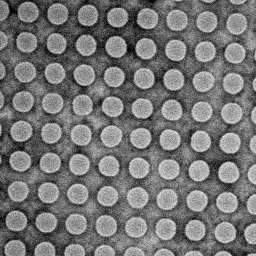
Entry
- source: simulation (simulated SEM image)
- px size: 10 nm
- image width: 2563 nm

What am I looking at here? an array of small figures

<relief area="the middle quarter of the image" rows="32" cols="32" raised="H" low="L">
LLLLHHLLLLLLLLLLLLLLLLLLLLLLLLLL
LLLHHHHLLLLHHHLLLLLHHLLLLLLLLLLL
LLLHHHHLLLHHHHHLLLHHHHLLLHHHHLLL
LLLHHHHLLLHHHHHLLLHHHHLLLHHHHHLL
LLLHHHHLLLLHHHHLLLHHHHLLLHHHHHLL
LLLLLLLLLLLLHLLLLLHHHHLLLHHHHLLL
LLLLLLLLLLLLLLLLLLLLLLLLLLLLLLLL
LLLLLLLLLLLLLLLLLLLLLLLLLLLLLLLL
LLLHHHLLLLLHHLLLLLLLLLLLLLLLLLLL
LLHHHHHLLLHHHHLLLLHHHLLLLLHHLLLL
LLHHHHHLLLHHHHHLLHHHHHLLLHHHHLLL
LLLHHHHLLLHHHHHLLHHHHHLLLHHHHLLL
LLLLHHLLLLLHHHLLLLHHHHLLLHHHHLLL
LLLLLLLLLLLLLLLLLLLLLLLLLHHHHLLL
LLLLLLLLLLLLLLLLLLLLLLLLLLLLLLLL
LLLHHLLLLLLLLLLLLLLLLLLLLLLLLLLL
LLHHHHLLLLHHHHLLLLHHHLLLLLLLLLLL
LLHHHHHLLHHHHHLLLHHHHLLLHHHHLLLL
LLHHHHHLLHHHHHLLLHHHHHLLHHHHHLLL
LLLHHHLLLLHHHHLLLHHHHLLLHHHHHLLL
LLLLLLLLLLLHHLLLLLHHHLLLLHHHLLLL
LLLLLLLLLLLLLLLLLLLLLLLLLLLLLLLL
LLLLLLLLLLLLLLLLLLLLLLLLLLLLLLLL
LLHHHHLLLLHHHLLLLLLLLLLLLLLLLLLL
LLHHHHLLLHHHHLLLLHHHHLLLLHHHLLLL
LHHHHHLLLHHHHHLLHHHHHLLLHHHHHLLL
LLHHHHLLLHHHHHLLHHHHHLLLHHHHHLLH
LLLHHLLLLLHHHLLLLHHHHLLLHHHHLLLH
LLLLLLLLLLLLLLLLLLLLLLLLLHHLLLLL
LLLLLLLLLLLLLLLLLLLLLLLLLLLLLLLL
LLHHHLLLLLLLLLLLLLLLLLLLLLLLLLLL
LHHHHHLLLHHHHLLLLHHHLLLLLHHLLLLL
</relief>